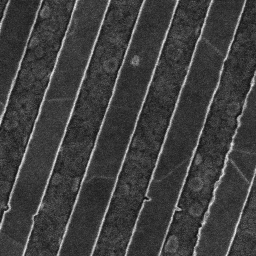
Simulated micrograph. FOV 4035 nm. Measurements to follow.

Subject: one or a few lines or trenches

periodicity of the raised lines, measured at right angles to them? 1010 nanometres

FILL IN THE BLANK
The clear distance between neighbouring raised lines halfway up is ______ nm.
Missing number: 504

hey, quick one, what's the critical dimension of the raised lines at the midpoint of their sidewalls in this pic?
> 504 nm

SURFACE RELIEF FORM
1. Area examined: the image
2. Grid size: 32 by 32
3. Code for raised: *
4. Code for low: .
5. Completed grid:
.****....*****....****....*****.
.*****...****.....****....****..
****.....****....****.....****..
****.....****....****....*****..
****....****....*****....****...
****....****....****.....****...
***....*****....****.*..*****...
***....****....*****....****....
**.....****....****.....****....
**....*****....****....*****....
**....****....*****....****....*
*.....****....****.....****....*
*....*****....****....*****....*
*....****....*****....****...***
.....****....****.....****....**
....****.....****....*****....**
....****....*****....****....***
....****....****.....****....***
...****.....****....*****....***
...****....*****....****....****
...****....****.....****....****
..****.....****....****.....****
..****....*****....****....*****
..****....****.....****....****.
.****.....****....****.....****.
.****....*****....****....*****.
.****....****....*****..*.****..
****.....****....****.....****..
****....*****....****....*****..
****....****....*****....****...
***.....****....******...****...
***....*****....****....*****...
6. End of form